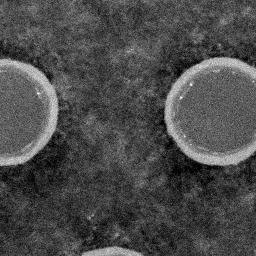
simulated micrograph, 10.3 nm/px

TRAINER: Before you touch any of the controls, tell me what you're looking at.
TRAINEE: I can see raised bodies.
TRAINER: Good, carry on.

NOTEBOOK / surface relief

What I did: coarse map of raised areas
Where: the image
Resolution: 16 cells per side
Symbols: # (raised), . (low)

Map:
................
................
................
................
##..........####
###........#####
###.......######
###.......######
###........#####
##..........####
................
................
................
................
................
................